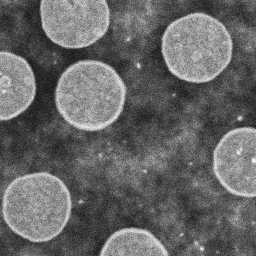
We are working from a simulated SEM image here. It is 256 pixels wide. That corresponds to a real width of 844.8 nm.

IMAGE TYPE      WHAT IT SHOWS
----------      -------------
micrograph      raised bodies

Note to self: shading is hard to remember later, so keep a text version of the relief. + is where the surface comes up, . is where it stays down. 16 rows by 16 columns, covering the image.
...++++.........
...++++....+++..
...+++....++++..
+.........++++..
++..+++....+++..
++..++++........
++..++++........
....+++.........
..............++
.............+++
.............+++
.+++..........++
++++............
++++............
.+++....+.......
......++++......